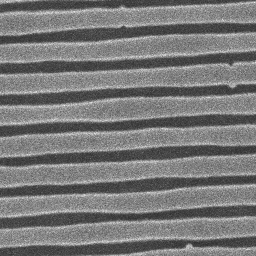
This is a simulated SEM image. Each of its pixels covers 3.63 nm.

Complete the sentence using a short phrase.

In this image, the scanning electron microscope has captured parallel lines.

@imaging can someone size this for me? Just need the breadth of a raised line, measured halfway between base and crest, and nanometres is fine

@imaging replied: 69.8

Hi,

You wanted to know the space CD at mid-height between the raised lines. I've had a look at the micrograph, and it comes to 11.3 pixels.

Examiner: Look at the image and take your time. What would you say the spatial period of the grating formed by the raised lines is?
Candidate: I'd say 111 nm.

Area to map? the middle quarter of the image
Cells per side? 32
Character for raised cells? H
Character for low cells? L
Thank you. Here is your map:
LLLLLLLLLLLLLLLLLLLLLLLLLLLLLLLL
LLLLLLLLLLLLLLLLHHHHHHHHHHHHHHHH
HHHHHHHHHHHHHHHHHHHHHHHHHHHHHHHH
HHHHHHHHHHHHHHHHHHHHHHHHHHHHHHHH
HHHHHHHHHHHHHHHHHHHHHHHHHHHHHHHH
HHHHHHHHHHHHHHHHHHHHHLLHLLHHHHHH
HHHLLLLLLLLLLLLLLLLLLLLLLLLLLLLL
LLLLLLLLLLLLLLLLLLLLLLLLLLLLLLLL
LLLLLLLLLLLLLLLLHHHHLHHHHHHHHHHH
LLLLLLHHHHHHHHHHHHHHHHHHHHHHHHHH
HHHHHHHHHHHHHHHHHHHHHHHHHHHHHHHH
HHHHHHHHHHHHHHHHHHHHHHHHHHHHHHHH
HHHHHHHHHHHHHHHHHHHHHHHHHHHHHHHH
HHHHHHHHHHHHHHHHHHHHHHLLLLLLLLLL
LLLLLLLLLLLLLLLLLLLLLLLLLLLLLLLL
LLLLLLLLLLLLLLLLLLLLLLLLLLLLLLLL
LLLLLLLLLLLLLLLLLLLHHHHHHHHHHHHH
HHHHHHHHHHHHHHHHHHHHHHHHHHHHHHHH
HHHHHHHHHHHHHHHHHHHHHHHHHHHHHHHH
HHHHHHHHHHHHHHHHHHHHHHHHHHHHHHHH
HHHHHHHHHHHHHHHHHHHHHHHHHLHLLLLL
HHHHHHHHHHHHHHHLLLLLLLLLLLLLLLLL
LLLLLLLLLLLLLLLLLLLLLLLLLLLLLLLL
LLLLLLLLLLLLLLLLLLLLLLLLLLLLLLLL
LLLLLLLLLLLLLLLLLHHHHHHHHHHHHHHH
HHHHHHHHHHHHHHHHHHHHHHHHHHHHHHHH
HHHHHHHHHHHHHHHHHHHHHHHHHHHHHHHH
HHHHHHHHHHHHHHHHHHHHHHHHHHHHHHHH
HHHHHHHHHHHHHHHHHHHHLLLLLLLLLLLL
HHHHHHHHHLLLLLLLLLLLLLLLLLLLLLLL
LLLLLLLLLLLLLLLLLLLLLLLLLLLLLLLL
LLLLLLLLLLLLLLLLLLLLLLLLLLHHHHHH